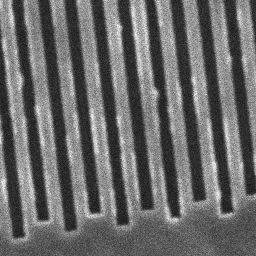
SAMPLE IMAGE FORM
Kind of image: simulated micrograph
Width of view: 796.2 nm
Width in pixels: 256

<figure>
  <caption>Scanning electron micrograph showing parallel lines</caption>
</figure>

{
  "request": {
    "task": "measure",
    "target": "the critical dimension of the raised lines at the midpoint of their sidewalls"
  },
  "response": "14.1 px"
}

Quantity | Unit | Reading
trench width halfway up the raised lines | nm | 38.6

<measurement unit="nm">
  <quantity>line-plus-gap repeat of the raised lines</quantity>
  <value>81.6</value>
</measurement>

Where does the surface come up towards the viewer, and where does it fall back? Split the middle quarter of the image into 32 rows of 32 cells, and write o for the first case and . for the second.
oo...oooo...ooo...oooo...ooo....
oo...oooo...ooo...oooo...ooo....
oo...oooo...ooo....ooo...ooo....
oo...oooo...ooo....ooo...oooo...
oo....ooo...oooo...ooo....ooo...
oo....ooo...oooo...oooo..oooo...
ooo...ooo....ooo...ooooo..ooo...
ooo...ooo....ooo...ooooo..ooo...
ooo...ooo....ooo...ooooo..ooo...
ooo...oooo...ooo....ooo...oooo..
ooo...oooo...ooo....ooo...ooo...
ooo...oooo...ooo....ooo...oooo..
ooo....ooo...ooo....oooo..oooo..
ooo....ooo...oooo...oooo..oooo..
ooo....ooo...oooo...oooo..oooo..
oooo...oooo..oooo...oooo..oooo..
.ooo...ooo....ooo...oooo...ooo..
.ooo...oooo...ooo....ooo...ooo..
.ooo...oooo...ooo....ooo...ooo..
.ooo...oooo...ooo....ooo...ooo..
.ooo...oooo...ooo....ooo...oooo.
.ooo....ooo...oooo...ooo....ooo.
.ooo....ooo...oooo...ooo....ooo.
.oooo...ooo...oooo...ooo....ooo.
.oooo...oooo..oooo...oooo...ooo.
..ooo...oooo..oooo...oooo...ooo.
..ooo...oooo..oooo....ooo...ooo.
..ooo...oooo...ooo....ooo...ooo.
..ooo...oooo...ooo....ooo...oooo
..ooo....ooo...ooo....ooo...oooo
..ooo....ooo...oooo...ooo....ooo
..ooo....ooo...oooo...ooo....ooo